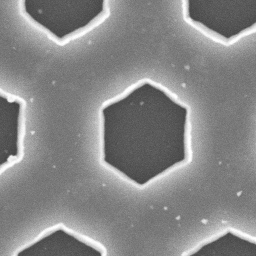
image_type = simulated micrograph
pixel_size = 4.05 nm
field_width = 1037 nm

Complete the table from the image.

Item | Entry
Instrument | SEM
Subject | holes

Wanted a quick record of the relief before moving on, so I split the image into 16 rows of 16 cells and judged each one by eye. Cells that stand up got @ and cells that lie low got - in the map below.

@@----@@@@@@----
@@----@@@@@@----
@@@@@@@@@@@@@@@@
@@@@@@@@@@@@@@@@
@@@@@@@@@@@@@@@@
@@@@@@@@@-@@@@@@
-@@@@@@----@@@@@
-@@@@@------@@@@
-@@@@@------@@@@
-@@@@@------@@@@
@@@@@@@----@@@@@
@@@@@@@@@@@@@@@@
@@@@@@@@@@@@@@@@
@@@@@@@@@@@@@@@@
@@@-@@@@@@@@@@@@
@@----@@@@@@----